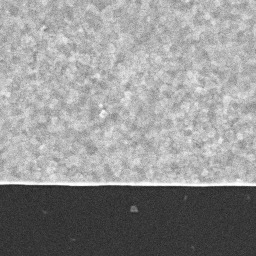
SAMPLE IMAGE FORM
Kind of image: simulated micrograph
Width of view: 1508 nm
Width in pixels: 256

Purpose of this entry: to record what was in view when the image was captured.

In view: wiring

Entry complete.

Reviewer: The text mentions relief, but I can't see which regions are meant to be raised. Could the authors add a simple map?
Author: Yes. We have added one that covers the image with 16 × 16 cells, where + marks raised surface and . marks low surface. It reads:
++++++++++++++++
++++++++++++++++
++++++++++++++++
++++++++++++++++
++++++++++++++++
++++++++++++++++
++++++++++++++++
++++++++++++++++
++++++++++++++++
++++++++++++++++
++++++++++++++++
..++++++++++++++
................
................
................
................